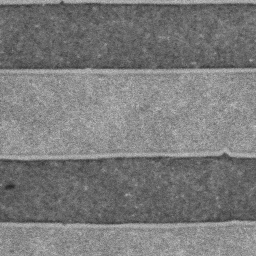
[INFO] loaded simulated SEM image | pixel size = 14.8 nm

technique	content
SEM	one or a few lines or trenches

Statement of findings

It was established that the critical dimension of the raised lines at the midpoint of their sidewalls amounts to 1.23 micrometres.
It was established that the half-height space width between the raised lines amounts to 1030 nm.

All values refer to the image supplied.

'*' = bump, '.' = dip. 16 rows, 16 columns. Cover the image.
................
................
................
................
.......*********
****************
****************
****************
****************
****************
................
................
................
................
****************
****************